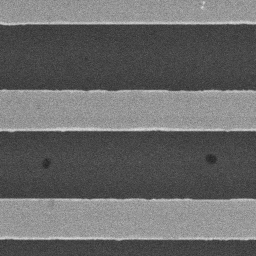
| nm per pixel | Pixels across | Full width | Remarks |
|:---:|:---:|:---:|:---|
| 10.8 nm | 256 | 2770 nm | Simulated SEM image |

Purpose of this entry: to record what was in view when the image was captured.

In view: lines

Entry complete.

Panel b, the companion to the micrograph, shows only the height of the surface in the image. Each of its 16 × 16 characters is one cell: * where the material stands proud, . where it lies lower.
****************
**..............
................
................
................
................
****************
****************
................
................
................
................
************..**
****************
****************
................